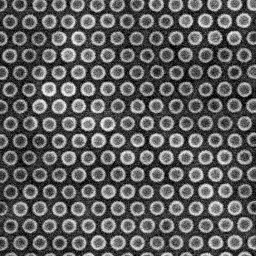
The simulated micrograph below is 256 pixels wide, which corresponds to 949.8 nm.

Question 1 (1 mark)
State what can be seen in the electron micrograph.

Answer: a regular array of raised bodies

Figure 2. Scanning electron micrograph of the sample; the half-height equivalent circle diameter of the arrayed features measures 48.3 nanometres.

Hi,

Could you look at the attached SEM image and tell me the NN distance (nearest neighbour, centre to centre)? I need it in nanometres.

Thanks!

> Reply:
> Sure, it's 70.9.